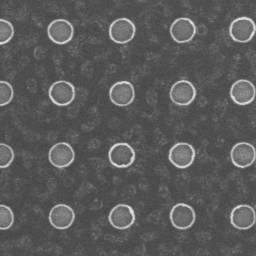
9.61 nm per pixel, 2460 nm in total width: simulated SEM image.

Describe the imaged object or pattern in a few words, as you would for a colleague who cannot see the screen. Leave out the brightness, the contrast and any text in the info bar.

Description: a regular array of holes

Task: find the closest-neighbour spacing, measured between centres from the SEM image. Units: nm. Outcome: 582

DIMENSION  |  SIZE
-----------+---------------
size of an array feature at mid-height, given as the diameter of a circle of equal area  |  22.5 pixels